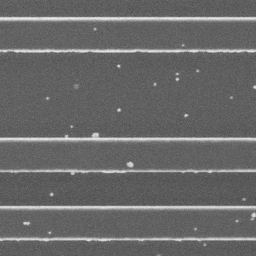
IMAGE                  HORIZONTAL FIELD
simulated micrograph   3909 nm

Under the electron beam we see lines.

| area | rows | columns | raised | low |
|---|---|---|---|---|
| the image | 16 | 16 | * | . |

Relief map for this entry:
................
****************
****************
................
................
................
................
................
................
****************
****************
................
................
****************
****************
................